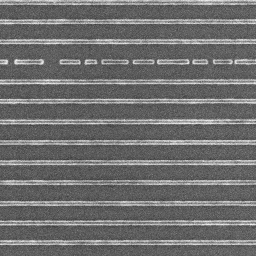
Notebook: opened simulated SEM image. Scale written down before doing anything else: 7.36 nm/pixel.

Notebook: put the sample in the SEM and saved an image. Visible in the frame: parallel lines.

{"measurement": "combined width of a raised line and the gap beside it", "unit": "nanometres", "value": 148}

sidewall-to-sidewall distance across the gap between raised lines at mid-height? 15.7 pixels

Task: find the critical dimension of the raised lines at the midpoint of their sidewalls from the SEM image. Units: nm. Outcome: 32.2